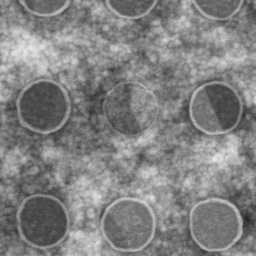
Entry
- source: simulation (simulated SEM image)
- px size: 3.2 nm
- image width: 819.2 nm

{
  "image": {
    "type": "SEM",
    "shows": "raised bodies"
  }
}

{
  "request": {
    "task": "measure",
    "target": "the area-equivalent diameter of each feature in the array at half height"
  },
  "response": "169 nm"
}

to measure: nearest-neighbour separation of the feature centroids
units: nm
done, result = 280